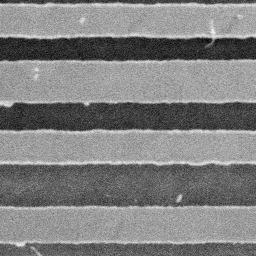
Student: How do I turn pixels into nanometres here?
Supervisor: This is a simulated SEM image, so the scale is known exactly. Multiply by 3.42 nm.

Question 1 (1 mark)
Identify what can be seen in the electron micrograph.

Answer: lines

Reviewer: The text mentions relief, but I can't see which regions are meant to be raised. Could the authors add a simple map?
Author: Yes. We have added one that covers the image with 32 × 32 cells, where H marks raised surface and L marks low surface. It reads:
LLHLLLHLLLLLHHHHLLLLLLLHHLLLLLLL
HHHHHHHHHHHHHHHHHHHHHHHHHHHHHHHH
HHHHHHHHHHHHHHHHHHHHHHHHHHHHHHHH
HHHHHHHHHHHHHHHHHHHHHHHHHHHHHHHH
HHHHHHHHHHHHHHHHHHHHHHHHHHHHHHHH
LLLLLLLLLLLLLLLLLLLLLLLLLLLLLLLL
LLLLLLLLLLLLLLLLLLLLLLLLLLLLLLLL
LLLLLLLLLLLLLLLLLLLLLLLLLLLLLLLL
HHHHHHHHHHHHHHHHHHHHHHHHHHHHHHHH
HHHHHHHHHHHHHHHHHHHHHHHHHHHHHHHH
HHHHHHHHHHHHHHHHHHHHHHHHHHHHHHHH
HHHHHHHHHHHHHHHHHHHHHHHHHHHHHHHH
HHHHHHHHHHHHHHHHHHHHHHHHHHHHHHHH
LLLLLLLLLLLLLLLLLLLLLLLLLLLLLLLL
LLLLLLLLLLLLLLLLLLLLLLLLLLLLLLLL
LLLLLLLLLLLLLLLLLLLLLLLLLLLLLLLL
HHHHHHHHHHHHHHHHHHHHHHHHHHHHHHHH
HHHHHHHHHHHHHHHHHHHHHHHHHHHHHHHH
HHHHHHHHHHHHHHHHHHHHHHHHHHHHHHHH
HHHHHHHHHHHHHHHHHHHHHHHHHHHHHHHH
LLLLLLHLLLLLLLLLLLLHHLLHHHLLHLLL
LLLLLLLLLLLLLLLLLLLLLLLLLLLLLLLL
LLLLLLLLLLLLLLLLLLLLLLLLLLLLLLLL
LLLLLLLLLLLLLLLLLLLLLLLLLLLLLLLL
LLLLLLLLLLLLLLLLLLLLLLLLLLLLLLLL
LLLLLLLLLLLLLLLLLLLLLLLLLLLLLLLL
HHHHHHHHHHHHHHHHHHHHHHHHHHHHHHHH
HHHHHHHHHHHHHHHHHHHHHHHHHHHHHHHH
HHHHHHHHHHHHHHHHHHHHHHHHHHHHHHHH
HHHHHHHHHHHHHHHHHHHHHHHHHHHHHHHH
LLLLLLLLLLLLLLLLLLLLLLLLLLLLLLLL
LLLLLLLLLLLLLLLLLLLLLLLLLLLLLLLL